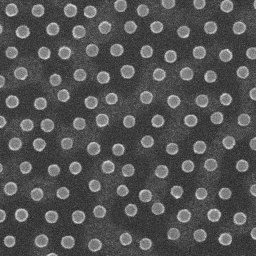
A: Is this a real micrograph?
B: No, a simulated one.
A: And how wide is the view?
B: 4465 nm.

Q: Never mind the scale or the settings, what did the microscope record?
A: a regular array of raised bodies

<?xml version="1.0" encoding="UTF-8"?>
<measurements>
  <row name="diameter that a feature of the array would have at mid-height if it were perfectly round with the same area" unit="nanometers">208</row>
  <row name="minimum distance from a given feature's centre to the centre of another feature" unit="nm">401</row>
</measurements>